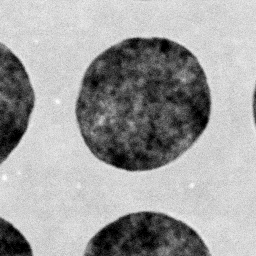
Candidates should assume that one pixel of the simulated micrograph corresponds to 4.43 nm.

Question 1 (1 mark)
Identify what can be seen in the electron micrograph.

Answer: holes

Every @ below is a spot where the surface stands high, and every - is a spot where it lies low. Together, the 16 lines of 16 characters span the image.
@@@@@@@@@@@@@@@@
@@@@@@@@@@@@@@@@
@@@@@@@@---@@@@@
-@@@@@------@@@@
--@@@--------@@@
--@@@--------@@@
--@@@--------@@@
--@@@--------@@@
-@@@@--------@@@
-@@@@@------@@@@
@@@@@@@---@@@@@@
@@@@@@@@@@@@@@@@
@@@@@@@@@@@@@@@@
@@@@@@@@---@@@@@
-@@@@@------@@@@
--@@@--------@@@